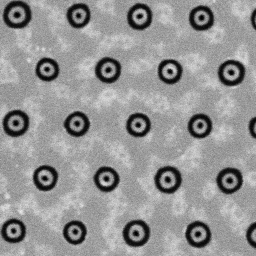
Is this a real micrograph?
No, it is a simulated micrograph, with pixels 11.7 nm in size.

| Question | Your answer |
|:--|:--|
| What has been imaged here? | a regular array of ring-shaped grooves with a dot in the middle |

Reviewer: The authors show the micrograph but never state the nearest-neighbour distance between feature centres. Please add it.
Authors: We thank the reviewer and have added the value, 719 nanometers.